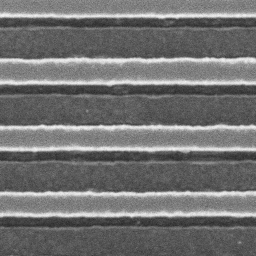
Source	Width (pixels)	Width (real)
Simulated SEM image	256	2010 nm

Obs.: lines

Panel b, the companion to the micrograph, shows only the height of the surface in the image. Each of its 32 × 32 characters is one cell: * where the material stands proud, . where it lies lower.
********************************
********************************
................................
................................
................................
................................
................................
***..***************************
********************************
********************************
................................
................................
................................
................................
................................
................................
********************************
********************************
********************************
................................
................................
................................
................................
................................
********************************
********************************
********************************
................................
................................
................................
................................
................................